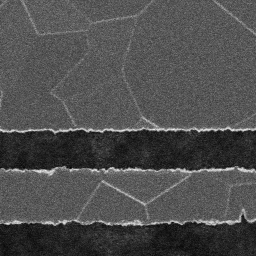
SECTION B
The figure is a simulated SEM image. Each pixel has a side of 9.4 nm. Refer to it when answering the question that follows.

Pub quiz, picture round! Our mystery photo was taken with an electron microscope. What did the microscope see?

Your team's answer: one or a few lines or trenches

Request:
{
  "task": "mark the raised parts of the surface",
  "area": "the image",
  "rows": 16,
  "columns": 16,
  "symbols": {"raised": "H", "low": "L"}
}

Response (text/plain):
HHHHHHHHHHHHHHHH
HHHHHHHHHHHHHHHH
HHHHHHHHHHHHHHHH
HHHHHHHHHHHHHHHH
HHHHHHHHHHHHHHHH
HHHHHHHHHHHHHHHH
HHHHHHHHHHHHHHHH
HHHHHHHHHHHHHHHH
LLLLLLLLLLLLLLLL
LLLLLLLLLLLLLLLL
LLLLLLLLLLLLLLLL
HHHHHHHHHHHHHHHH
HHHHHHHHHHHHHHHH
HHHHHHHHHHHHHHHH
LLLLLLLLLLLLLLLL
LLLLLLLLLLLLLLLL